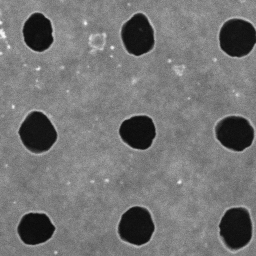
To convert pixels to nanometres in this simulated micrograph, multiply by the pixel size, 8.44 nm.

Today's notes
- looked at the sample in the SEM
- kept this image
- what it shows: a regular array of holes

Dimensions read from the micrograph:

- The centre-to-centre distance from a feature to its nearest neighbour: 804 nm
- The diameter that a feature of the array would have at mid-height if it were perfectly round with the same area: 298 nm